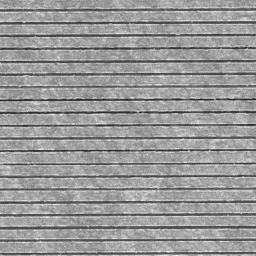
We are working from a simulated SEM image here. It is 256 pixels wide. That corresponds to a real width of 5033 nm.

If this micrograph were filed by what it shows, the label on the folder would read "parallel lines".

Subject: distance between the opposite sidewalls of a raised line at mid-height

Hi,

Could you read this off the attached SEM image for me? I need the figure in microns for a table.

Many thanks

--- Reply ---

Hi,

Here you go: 0.197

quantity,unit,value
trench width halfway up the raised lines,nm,54.1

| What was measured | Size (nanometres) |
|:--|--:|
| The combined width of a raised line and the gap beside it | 252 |